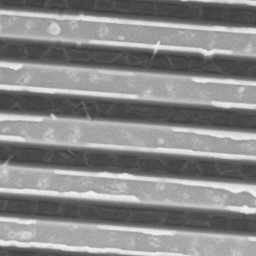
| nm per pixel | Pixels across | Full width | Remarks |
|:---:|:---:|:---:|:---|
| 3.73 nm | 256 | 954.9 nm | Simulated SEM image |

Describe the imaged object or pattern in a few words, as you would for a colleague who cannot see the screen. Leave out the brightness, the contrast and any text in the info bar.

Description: parallel lines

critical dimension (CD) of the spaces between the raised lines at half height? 76.1 nm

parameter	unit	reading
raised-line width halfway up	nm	116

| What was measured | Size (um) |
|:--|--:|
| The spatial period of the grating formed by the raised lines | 0.193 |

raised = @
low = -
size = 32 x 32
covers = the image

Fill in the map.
----------------------------@@@@
@@@@@@@-------------------------
@@@@@@@@@@@@@@@@@@@@------------
@@@@@@@@@@@@@@@@@@@@@@@@@@@@@@@@
@@@@@@@@@@@@@@@@@@@@@@@@@@@@@@@@
---------@@@@@@@@@@@@@@@@@@@@@@@
----------------------@@@@@@@@@@
@-------------------------------
@@@@@@@@@@@@@@------------------
@@@@@@@@@@@@@@@@@@@@@@@@@-------
@@@@@@@@@@@@@@@@@@@@@@@@@@@@@@@@
---@@@@@@@@@@@@@@@@@@@@@@@@@@@@@
--------------@@@@@@@@@@@@@@@@@@
---------------------------@@@@@
@@@@@@@-------------------------
@@@@@@@@@@@@@@@@@@@-------------
@@@@@@@@@@@@@@@@@@@@@@@@@@@@@@@@
@@@@@@@@@@@@@@@@@@@@@@@@@@@@@@@@
--------@@@@@@@@@@@@@@@@@@@@@@@@
---------------------@@@@@@@@@@@
@-------------------------------
@@@@@@@@@@@@@-------------------
@@@@@@@@@@@@@@@@@@@@@@@@@@------
@@@@@@@@@@@@@@@@@@@@@@@@@@@@@@@@
--@@@@@@@@@@@@@@@@@@@@@@@@@@@@@@
---------------@@@@@@@@@@@@@@@@@
----------------------------@@@@
@@@@@@@-------------------------
@@@@@@@@@@@@@@@@@@@@------------
@@@@@@@@@@@@@@@@@@@@@@@@@@@@@@@@
@@@@@@@@@@@@@@@@@@@@@@@@@@@@@@@@
---------@@@@@@@@@@@@@@@@@@@@@@@